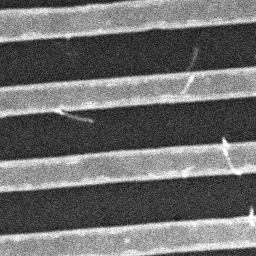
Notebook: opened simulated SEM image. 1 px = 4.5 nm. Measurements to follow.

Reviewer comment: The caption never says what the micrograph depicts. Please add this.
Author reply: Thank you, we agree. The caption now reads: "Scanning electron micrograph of one or a few lines or trenches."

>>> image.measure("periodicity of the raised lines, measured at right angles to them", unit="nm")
335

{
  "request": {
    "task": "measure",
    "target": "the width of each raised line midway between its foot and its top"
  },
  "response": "123 nm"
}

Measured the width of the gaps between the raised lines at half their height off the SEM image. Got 214 nm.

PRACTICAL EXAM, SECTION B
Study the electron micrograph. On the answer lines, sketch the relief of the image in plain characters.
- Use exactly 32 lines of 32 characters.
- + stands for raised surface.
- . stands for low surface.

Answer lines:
...............+++++++++++++++++
++++++++++++++++++++++++++++++++
++++++++++++++++++++++++++++++++
++++++++++++++++++..............
+++++++.+.......................
................................
................................
................................
................................
.....................+++++++++++
........++++++++++++++++++++++++
++++++++++++++++++++++++++++++++
++++++++++++++++++++++++........
+++++++++.......................
................................
................................
................................
................................
........................++++++++
...........+++++++++++++++++++++
++++++++++++++++++++++++++++++++
++++++++++++++++++++++++++++++..
++++++++++++++..................
+++++...........................
................................
................................
................................
.............................+++
................++++++++++++++++
....++++++++++++++++++++++++++++
++++++++++++++++++++++++++++++++
+++++++++++++++++++.............